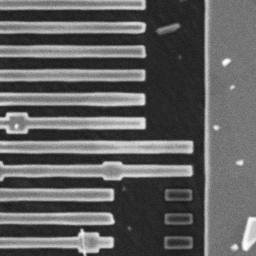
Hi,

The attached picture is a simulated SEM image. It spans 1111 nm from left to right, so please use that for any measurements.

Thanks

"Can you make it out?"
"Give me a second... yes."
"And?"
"wiring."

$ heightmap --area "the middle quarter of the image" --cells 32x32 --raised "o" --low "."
................................
oooo............................
oooooooooooooooooooo............
oooooooooooooooooooo............
................................
................................
................................
.......oooooooo.................
oooooooooooooooooooo............
oooooooooooooooooooo............
................................
................................
................................
o........ooooo..................
oooooooooooooooooooo............
oooooooooooooooooooo............
................................
................................
................................
oooooooooooooooooooooooooooooooo
oooooooooooooooooooooooooooooooo
oooooooooooooooooooooooooooooooo
................................
................................
................................
...ooooooooooooooooooooo........
oooooooooooooooooooooooooooooooo
oooooooooooooooooooooooooooooooo
..........oooo..................
................................
................................
oooooooooooo..............oooooo